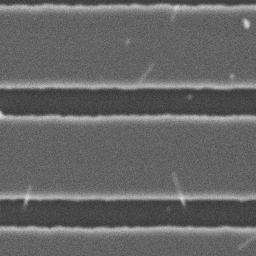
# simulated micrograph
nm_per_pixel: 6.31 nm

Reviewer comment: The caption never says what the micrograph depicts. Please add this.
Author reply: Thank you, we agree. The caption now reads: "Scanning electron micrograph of lines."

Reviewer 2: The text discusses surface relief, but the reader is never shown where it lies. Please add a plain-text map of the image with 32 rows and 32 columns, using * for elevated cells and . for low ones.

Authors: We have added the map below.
................................
********************************
********************************
********************************
********************************
********************************
********************************
********************************
********************************
********************************
********************************
................................
................................
................................
**...***......************...***
********************************
********************************
********************************
********************************
********************************
********************************
********************************
********************************
********************************
********************************
................................
................................
................................
**********..*******************.
********************************
********************************
********************************